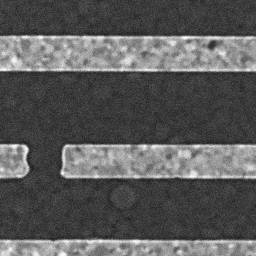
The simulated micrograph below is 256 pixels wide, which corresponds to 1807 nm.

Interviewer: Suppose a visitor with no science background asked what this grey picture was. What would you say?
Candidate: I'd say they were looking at one or a few lines or trenches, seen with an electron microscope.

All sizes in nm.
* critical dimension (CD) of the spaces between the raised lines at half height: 526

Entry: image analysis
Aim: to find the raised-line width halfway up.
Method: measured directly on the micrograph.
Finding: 0.236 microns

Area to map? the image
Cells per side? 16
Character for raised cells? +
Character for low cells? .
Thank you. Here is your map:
................
................
++++++++++++++++
++++++++++++++++
................
................
................
................
................
++..++++++++++++
++..++++++++++++
................
.......+........
................
................
++++++++++++++++